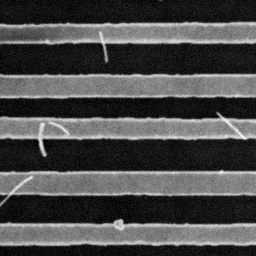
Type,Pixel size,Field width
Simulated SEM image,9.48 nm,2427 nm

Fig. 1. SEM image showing lines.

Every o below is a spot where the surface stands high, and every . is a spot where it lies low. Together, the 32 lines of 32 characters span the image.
................................
................................
................................
oooooooooooooooooooooooooooooooo
oooooooooooooooooooooooooooooooo
................................
................................
................................
................................
oooooooooooooooooooooooooooooooo
oooooooooooooooooooooooooooooooo
oooooooooooooooooooooooooooooooo
................................
................................
................................
oooooooooooooooooooooooooooooooo
oooooooooooooooooooooooooooooooo
.....o..........................
................................
................................
................................
....ooo..ooooooooooooooooooooooo
oooooooooooooooooooooooooooooooo
oooooooooooooooooooooooooooooooo
................................
................................
................................
................................
oooooooooooooooooooooooooooooooo
oooooooooooooooooooooooooooooooo
ooooooooooo.oooooooooooooooooooo
................................